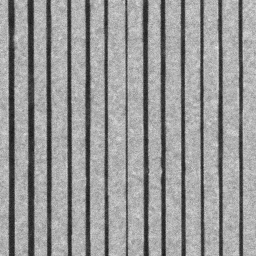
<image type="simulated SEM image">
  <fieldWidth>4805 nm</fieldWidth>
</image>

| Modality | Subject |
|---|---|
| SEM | parallel lines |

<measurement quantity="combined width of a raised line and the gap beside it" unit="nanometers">357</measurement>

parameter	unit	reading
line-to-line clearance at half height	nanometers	98.5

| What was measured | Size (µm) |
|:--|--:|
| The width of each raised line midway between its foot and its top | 0.267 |